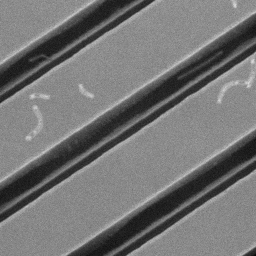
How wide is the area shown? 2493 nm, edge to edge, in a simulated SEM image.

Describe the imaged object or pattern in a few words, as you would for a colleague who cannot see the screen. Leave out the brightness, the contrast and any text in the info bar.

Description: lines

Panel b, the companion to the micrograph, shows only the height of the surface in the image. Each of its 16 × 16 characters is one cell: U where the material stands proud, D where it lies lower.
UUUUUDDDDUUUUUUU
UUUUDDDDUUUUUUUD
UUDDDDUUUUUUUDDD
UDDDDUUUUUUUDDDD
DDDUUUUUUUDDDDUU
DUUUUUUUUDDDDUUU
UUUUUUUDDDDUUUUU
UUUUUUDDDDUUUUUU
UUUUDDDDUUUUUUUD
UUUDDDDUUUUUUUDD
UDDDDUUUUUUUDDDD
DDDDUUUUUUUDDDDU
DDUUUUUUUDDDDUUU
DUUUUUUUDDDDUUUU
UUUUUUDDDDUUUUUU
UUUUUDDDDUUUUUUU